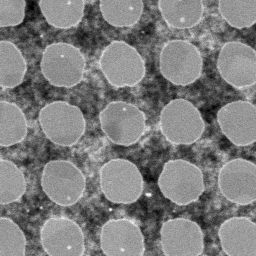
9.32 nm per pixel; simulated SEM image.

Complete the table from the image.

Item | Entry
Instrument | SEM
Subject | a regular array of raised bodies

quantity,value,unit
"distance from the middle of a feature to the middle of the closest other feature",58.3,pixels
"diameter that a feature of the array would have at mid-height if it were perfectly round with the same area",412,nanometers